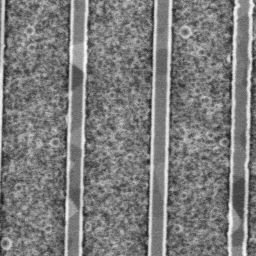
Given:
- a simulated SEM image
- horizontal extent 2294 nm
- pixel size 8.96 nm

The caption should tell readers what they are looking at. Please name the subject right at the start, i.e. one or a few lines or trenches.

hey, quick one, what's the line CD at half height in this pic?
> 0.131 µm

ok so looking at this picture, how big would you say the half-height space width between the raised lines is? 0.61 microns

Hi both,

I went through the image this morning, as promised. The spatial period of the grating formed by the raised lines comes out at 734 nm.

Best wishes